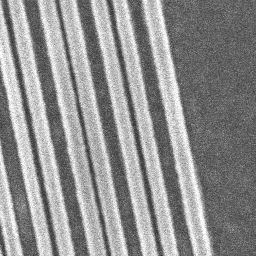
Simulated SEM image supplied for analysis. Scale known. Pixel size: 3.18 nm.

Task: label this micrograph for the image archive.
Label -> parallel lines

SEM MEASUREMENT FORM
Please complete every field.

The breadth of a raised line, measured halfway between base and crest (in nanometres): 43.6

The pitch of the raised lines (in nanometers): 82.4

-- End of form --